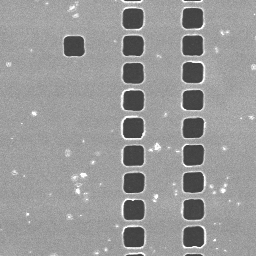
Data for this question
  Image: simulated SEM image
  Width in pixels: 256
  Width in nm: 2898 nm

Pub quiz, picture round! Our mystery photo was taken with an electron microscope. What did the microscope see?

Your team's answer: a regular array of holes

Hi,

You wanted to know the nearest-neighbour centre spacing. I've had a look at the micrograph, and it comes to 307 nanometers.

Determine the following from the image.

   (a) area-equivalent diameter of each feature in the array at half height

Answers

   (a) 0.253 µm